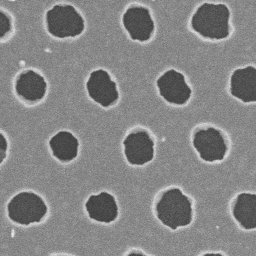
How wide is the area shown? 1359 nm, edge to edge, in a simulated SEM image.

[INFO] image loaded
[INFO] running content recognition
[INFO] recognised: a regular array of holes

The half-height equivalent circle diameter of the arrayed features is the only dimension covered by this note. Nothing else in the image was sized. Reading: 174 nm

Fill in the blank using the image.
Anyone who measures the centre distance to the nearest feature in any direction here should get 0.371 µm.